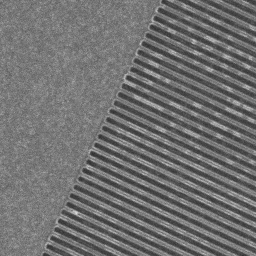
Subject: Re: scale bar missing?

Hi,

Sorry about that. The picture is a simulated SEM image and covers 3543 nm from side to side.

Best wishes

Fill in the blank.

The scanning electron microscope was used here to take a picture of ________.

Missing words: parallel lines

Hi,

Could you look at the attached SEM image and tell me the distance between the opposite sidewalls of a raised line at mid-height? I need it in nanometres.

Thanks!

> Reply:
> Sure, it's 51.7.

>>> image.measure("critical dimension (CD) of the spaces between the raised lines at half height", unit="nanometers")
78.3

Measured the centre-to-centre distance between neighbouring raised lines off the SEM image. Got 129 nanometers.